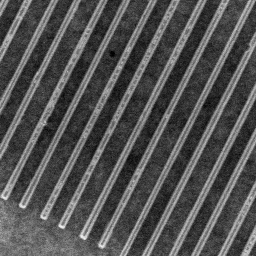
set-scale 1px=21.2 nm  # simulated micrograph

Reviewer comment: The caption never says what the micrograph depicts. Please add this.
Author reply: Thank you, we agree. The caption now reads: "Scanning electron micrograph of parallel lines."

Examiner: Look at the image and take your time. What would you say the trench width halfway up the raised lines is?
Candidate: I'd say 339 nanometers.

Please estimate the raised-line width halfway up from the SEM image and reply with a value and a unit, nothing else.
114 nm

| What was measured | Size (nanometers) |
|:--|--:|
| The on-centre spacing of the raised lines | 467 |